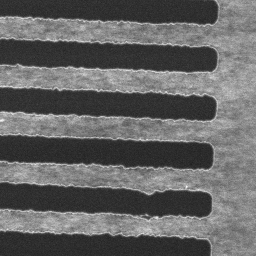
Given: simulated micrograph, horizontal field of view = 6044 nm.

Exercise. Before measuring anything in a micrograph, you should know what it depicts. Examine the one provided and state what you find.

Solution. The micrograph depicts parallel lines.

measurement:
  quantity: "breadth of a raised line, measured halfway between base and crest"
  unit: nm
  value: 660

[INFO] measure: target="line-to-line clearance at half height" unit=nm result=478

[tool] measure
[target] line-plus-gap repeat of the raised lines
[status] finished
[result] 48.1 pixels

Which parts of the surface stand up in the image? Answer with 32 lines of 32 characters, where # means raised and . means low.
###########################.....
###########################.....
........###################.....
................................
................................
####################............
###########################.....
###########################.....
.....##..##################.....
................................
................................
####################............
###########################.....
###########################.....
.......#.##################.....
................................
................................
####################............
###########################.....
###########################.....
.....######################.....
................................
................................
################................
##########################......
###########################.....
.....#####################......
..................#.............
................................
######################..........
##########################......
##########################......